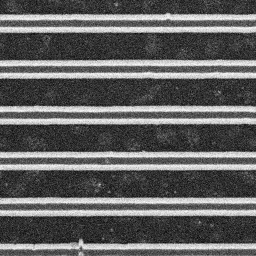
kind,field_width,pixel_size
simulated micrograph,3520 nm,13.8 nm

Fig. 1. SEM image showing parallel lines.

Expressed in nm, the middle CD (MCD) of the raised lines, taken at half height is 179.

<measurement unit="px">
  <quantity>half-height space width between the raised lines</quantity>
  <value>32.9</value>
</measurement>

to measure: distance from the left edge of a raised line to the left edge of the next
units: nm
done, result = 629